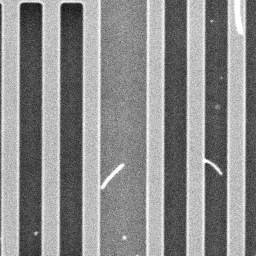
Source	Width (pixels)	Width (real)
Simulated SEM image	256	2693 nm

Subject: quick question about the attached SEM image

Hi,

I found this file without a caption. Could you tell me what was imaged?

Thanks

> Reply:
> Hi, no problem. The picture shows groups of lines, slits or small figures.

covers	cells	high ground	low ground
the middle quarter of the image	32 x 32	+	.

.....++++............++++......+
.....++++............++++......+
.....++++............++++......+
.....++++............++++......+
.....++++............++++......+
.....++++............++++......+
.....++++............++++......+
.....++++............++++......+
.....++++............++++......+
.....++++............++++......+
.....++++............++++......+
.....++++............++++......+
.....++++............++++......+
.....++++............++++......+
.....++++............++++......+
.....++++............++++......+
.....++++............++++......+
.....++++............++++......+
.....++++............++++......+
.....++++............++++......+
.....++++............++++......+
.....++++............++++......+
.....++++............++++......+
.....++++............++++......+
.....++++............++++......+
.....++++............++++......+
.....++++............++++......+
.....++++............++++......+
.....++++............++++......+
.....++++............++++......+
.....++++............++++......+
.....++++............++++......+